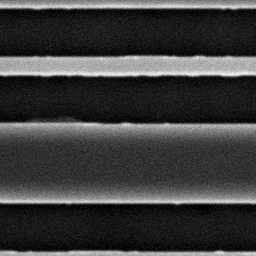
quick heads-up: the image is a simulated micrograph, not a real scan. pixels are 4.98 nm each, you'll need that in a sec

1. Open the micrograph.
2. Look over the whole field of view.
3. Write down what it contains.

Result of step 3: lines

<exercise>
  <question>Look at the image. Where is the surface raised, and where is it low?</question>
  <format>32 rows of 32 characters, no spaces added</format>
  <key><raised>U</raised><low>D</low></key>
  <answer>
UUUUUUUUUUUUUUUUUUUUUUUUUUUUUUUU
DDDDDDDDDDDDDDDDDDDDDDDDDDDDDDDD
DDDDDDDDDDDDDDDDDDDDDDDDDDDDDDDD
DDDDDDDDDDDDDDDDDDDDDDDDDDDDDDDD
DDDDDDDDDDDDDDDDDDDDDDDDDDDDDDDD
DDDDDDDDDDDDDDDDDDDDDDDDDDDDDDDD
DDDDDDDDDDDDDDDDDDDDDDDDDDDDDDDD
UUUUUUUUUUUUUUUUUUUUUUUUUUUUUUUU
UUUUUUUUUUUUUUUUUUUUUUUUUUUUUUUU
DDDDDDDDDDDDDDDDDDDDDDDDDDDDDDDD
DDDDDDDDDDDDDDDDDDDDDDDDDDDDDDDD
DDDDDDDDDDDDDDDDDDDDDDDDDDDDDDDD
DDDDDDDDDDDDDDDDDDDDDDDDDDDDDDDD
DDDDDDDDDDDDDDDDDDDDDDDDDDDDDDDD
DDDDDDDDDDDDDDDDDDDDDDDDDDDDDDDD
UUUUUUUUUUUUUDDUUDDDUDDDDDDDDDDD
UUUUUUUUUUUUUUUUUUUUUUUUUUUUUUUU
UUUUUUUUUUUUUUUUUUUUUUUUUUUUUUUU
UUUUUUUUUUUUUUUUUUUUUUUUUUUUUUUU
UUUUUUUUUUUUUUUUUUUUUUUUUUUUUUUU
UUUUUUUUUUUUUUUUUUUUUUUUUUUUUUUU
UUUUUUUUUUUUUUUUUUUUUUUUUUUUUUUU
UUUUUUUUUUUUUUUUUUUUUUUUUUUUUUUU
UUUUUUUUUUUUUUUUUUUUUUUUUUUUUUUU
UUUUUUUUUUUUUUUUUUUUUUUUUUUUUUUU
DDDDDDDDDDDDDDDDDDDDDDDDDDDDDDDD
DDDDDDDDDDDDDDDDDDDDDDDDDDDDDDDD
DDDDDDDDDDDDDDDDDDDDDDDDDDDDDDDD
DDDDDDDDDDDDDDDDDDDDDDDDDDDDDDDD
DDDDDDDDDDDDDDDDDDDDDDDDDDDDDDDD
DDDDDDDDDDDDDDDDDDDDDDDDDDDDDDDD
UUDUDDDDUUUUUUUUUDDDDDDDDDDUDDDD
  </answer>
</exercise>